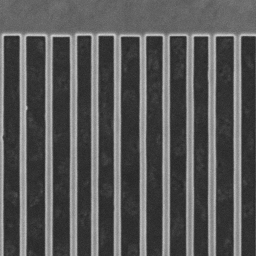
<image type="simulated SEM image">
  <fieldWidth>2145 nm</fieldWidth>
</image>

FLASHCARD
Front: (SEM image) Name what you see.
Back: parallel lines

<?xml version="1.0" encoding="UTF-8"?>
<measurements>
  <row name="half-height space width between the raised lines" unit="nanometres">146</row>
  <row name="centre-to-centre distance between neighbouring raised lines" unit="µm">0.199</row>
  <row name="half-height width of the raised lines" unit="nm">57.6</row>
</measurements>